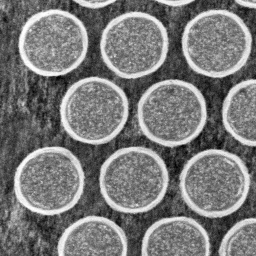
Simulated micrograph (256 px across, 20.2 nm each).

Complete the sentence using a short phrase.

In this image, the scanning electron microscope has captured a regular array of raised bodies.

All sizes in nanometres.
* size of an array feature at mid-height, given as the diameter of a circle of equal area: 1270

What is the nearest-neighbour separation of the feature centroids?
1570 nm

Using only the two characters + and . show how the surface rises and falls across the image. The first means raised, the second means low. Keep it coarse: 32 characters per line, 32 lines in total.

...........++...................
................................
....+++++......++++.....++++++..
...+++++++....++++++....++++++..
...++++++++..++++++++..++++++++.
...++++++++..++++++++..++++++++.
...+++++++...++++++++..++++++++.
...+++++++...+++++++....++++++..
....+++++.....+++++......++++...
................................
..........++++......+++........+
.........++++++....+++++.....+++
........+++++++...+++++++....+++
........++++++++..+++++++...++++
........++++++++..+++++++...++++
........+++++++...+++++++...++++
.........+++++....+++++++....+++
..........+++.......+++.......++
................................
....+++++.....+++++......++++...
...+++++++...+++++++....++++++..
..++++++++...+++++++...++++++++.
..++++++++...++++++++..++++++++.
..++++++++...+++++++...++++++++.
...+++++++...+++++++...+++++++..
...++++++.....+++++.....++++++..
.........................+++....
...........++........++.........
.........+++++.....++++++.....++
........+++++++...++++++++...+++
........+++++++...++++++++..++++
........++++++++..++++++++..++++